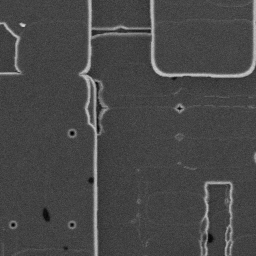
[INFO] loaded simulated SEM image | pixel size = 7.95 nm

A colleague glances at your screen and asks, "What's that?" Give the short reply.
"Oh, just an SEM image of wiring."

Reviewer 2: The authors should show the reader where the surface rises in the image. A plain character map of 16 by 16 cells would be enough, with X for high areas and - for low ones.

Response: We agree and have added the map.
XXXXXX----XXXXXX
XXXXXX----XXXXXX
XXXXXX----XXXXXX
XXXXXX----XXXXXX
XXXXXX----XXXXXX
XXXXXX----------
XXXXXX----------
XXXXXX----------
XXXXXX----------
XXXXXX----------
XXXXXX----------
XXXXXX----------
XXXXXX----------
XXXXXX----------
XXXXXX----------
XXXXXX----------